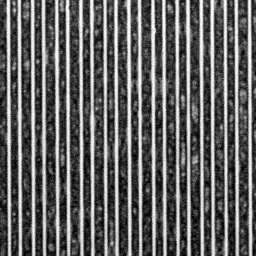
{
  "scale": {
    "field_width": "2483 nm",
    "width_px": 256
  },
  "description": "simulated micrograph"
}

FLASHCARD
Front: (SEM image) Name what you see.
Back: parallel lines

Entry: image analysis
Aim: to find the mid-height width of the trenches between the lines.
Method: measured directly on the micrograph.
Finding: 89.7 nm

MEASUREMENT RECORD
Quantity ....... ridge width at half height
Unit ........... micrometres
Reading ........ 0.0267